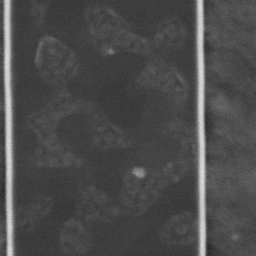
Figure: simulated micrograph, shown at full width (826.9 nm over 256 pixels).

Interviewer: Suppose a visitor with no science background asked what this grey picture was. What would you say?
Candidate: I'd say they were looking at wiring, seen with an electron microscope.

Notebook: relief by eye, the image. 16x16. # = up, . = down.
#############...
#############...
#############...
#############...
#############...
#############...
#############...
.############...
.############...
.############...
.############...
.############...
.############...
.############...
.############...
.############...